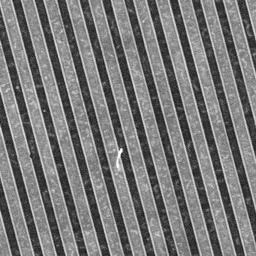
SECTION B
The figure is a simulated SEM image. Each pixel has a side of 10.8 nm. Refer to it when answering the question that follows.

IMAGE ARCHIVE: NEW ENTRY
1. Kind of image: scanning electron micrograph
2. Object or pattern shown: parallel lines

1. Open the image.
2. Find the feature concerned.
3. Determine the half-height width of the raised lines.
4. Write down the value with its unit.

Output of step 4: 129 nanometres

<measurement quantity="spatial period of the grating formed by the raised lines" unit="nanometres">234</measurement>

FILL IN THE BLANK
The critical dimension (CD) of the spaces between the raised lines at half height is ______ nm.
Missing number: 111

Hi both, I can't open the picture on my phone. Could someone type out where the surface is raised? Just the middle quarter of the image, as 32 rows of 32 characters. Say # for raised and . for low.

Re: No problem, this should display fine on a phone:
##...###...###..###...###..####.
###..###...###..###...###...###.
###..###...###...###..###...###.
###...###..###...###...###..###.
###...###...###..###...###...###
.###..###...###..####..###...###
.###..####..###...###...##...###
.###...###..###...###...###..###
.####..###...###..###...###...##
..###..###...###...###..###...##
..###...###..###...###..###...##
..###...###...###..###...###..##
...###..###...###..###...###...#
...###..###...###...###..###...#
...###...###..###...###..###...#
#..###...###...###..###...###..#
#...###..###...###..###...###...
#...###..###...###...###..###...
#...###...###..###...###...##...
##..###...###...###..###...###..
##...###..###...###..###...###..
##...###..####..###...###..###..
##...###...###..###...###...###.
###..###...###...###..###...###.
###...###..###...###..####..###.
###...###..####..###...###..###.
.##...###...###..###...###...###
.###..####..###...###..###...###
.###...###..###...###...###..###
.####..###...###..###...###...##
..###..###...###...###..###...##
..###...###..###...###..###...##